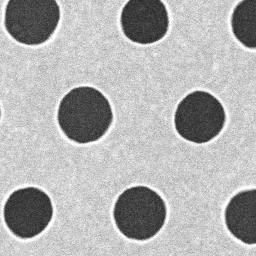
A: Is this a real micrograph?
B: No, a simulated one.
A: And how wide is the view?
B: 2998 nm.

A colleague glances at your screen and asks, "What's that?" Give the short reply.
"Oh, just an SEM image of holes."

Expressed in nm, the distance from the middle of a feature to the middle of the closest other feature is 1310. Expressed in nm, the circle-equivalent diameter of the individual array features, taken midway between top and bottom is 622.